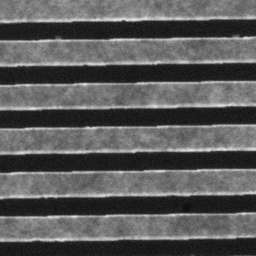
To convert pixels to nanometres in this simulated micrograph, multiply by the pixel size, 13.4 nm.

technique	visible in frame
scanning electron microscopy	lines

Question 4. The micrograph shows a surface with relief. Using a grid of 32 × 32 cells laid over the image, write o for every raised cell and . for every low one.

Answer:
oooooooooooooooooooooooooooooooo
oooooooooooooooooooooooooooooooo
ooooooooooooo...................
................................
................................
oooooooooooooooooooooooooooooooo
oooooooooooooooooooooooooooooooo
oooooooooooooooooooooooooooooooo
................................
................................
.........ooooooooooooooooooooooo
oooooooooooooooooooooooooooooooo
oooooooooooooooooooooooooooooooo
ooooooooo.......................
................................
................................
oooooooooooooooooooooooooooooooo
oooooooooooooooooooooooooooooooo
oooooooooooooooooooooooooooooooo
................................
................................
.........ooooooooooooooooooooooo
oooooooooooooooooooooooooooooooo
oooooooooooooooooooooooooooooooo
ooooooooooo.....................
................................
................................
oooooooooooooooooooooooooooooooo
oooooooooooooooooooooooooooooooo
oooooooooooooooooooooooooooooooo
................................
................................